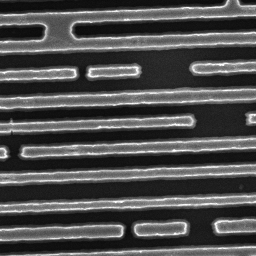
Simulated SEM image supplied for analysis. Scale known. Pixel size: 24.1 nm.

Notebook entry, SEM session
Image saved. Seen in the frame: parallel lines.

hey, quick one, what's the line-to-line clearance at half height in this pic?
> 0.341 microns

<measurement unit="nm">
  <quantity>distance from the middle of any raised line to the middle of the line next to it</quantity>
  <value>648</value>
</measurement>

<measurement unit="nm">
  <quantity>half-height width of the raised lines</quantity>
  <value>292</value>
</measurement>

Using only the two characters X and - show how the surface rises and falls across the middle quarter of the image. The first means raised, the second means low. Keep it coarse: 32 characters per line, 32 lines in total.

----------------XX--------------
XXX---XXXXXXXXXXXXX-------------
XXX---XXXXXXXXXXXXX-------------
XXX-----------------------------
--------------------------------
--------------------------------
--------------------------------
-----XX-X--XXXXXXXXXXXXXXXXXXXXX
XXXXXXXXXXXXXXXXXXXXXXXXXXXXXXXX
XXXXXXXXXXXXXXXXXXXXXXXXXXXXXXXX
XXXXXXXXXXXXX-------------------
--------------------------------
--------------------------------
--------------XXXXX-XXXXXXXXXXXX
XXXXXXXXXXXXXXXXXXXXXXXXXXXXXXXX
XXXXXXXXXXXXXXXXXXXXXXXXXXXXXXXX
XXX----XX-----------------------
--------------------------------
--------------------------------
---------------------XXXXXXXXXXX
XXXXXXXXXXXXXXXXXXXXXXXXXXXXXXXX
XXXXXXXXXXXXXXXXXXXXXXXXXXXXXXXX
XXXXXXXXXXXX--XXXX--------------
--------------------------------
--------------------------------
--------------------------------
------XXXXXXXXXXXXXXXXXXXXXXXXXX
XXXXXXXXXXXXXXXXXXXXXXXXXXXXXXXX
XXXXXXXXXXXXXXXXXXXXX-----------
--------------------------------
--------------------------------
--------------------------------